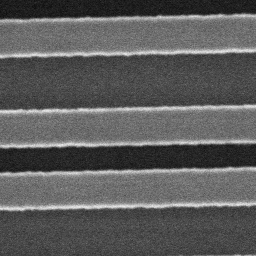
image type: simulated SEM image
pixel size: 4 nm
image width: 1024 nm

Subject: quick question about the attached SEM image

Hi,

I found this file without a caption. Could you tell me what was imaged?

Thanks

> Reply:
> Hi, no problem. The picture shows lines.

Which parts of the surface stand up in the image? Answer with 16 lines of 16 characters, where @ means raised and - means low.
----------------
@@@@@@@@@@@@@@@@
@@@@@@@@@@@@@@@@
@@@-------------
----------------
----------------
----------------
@@@@@@@@@@@@@@@@
@@@@@@@@@@@@@@@@
----------------
--------------@@
@@@@@@@@@@@@@@@@
@@@@@@@@@@@@@@@@
----------------
----------------
----------------